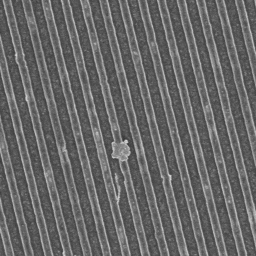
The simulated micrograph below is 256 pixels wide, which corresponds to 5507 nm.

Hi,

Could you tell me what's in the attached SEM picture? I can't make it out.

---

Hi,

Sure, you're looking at parallel lines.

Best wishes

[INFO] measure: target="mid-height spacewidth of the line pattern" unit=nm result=233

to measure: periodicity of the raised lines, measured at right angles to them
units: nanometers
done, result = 405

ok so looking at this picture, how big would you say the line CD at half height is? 0.175 um